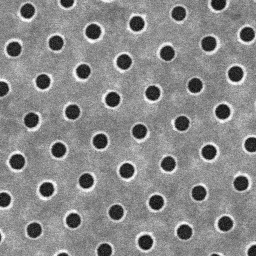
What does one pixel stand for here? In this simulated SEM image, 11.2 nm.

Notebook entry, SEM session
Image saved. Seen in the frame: a regular array of holes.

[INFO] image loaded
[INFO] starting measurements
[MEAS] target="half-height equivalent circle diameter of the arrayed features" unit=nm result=182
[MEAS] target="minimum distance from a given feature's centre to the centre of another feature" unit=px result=40.3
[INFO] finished